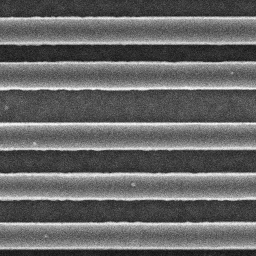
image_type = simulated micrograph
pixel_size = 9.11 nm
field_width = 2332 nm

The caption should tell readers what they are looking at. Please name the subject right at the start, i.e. lines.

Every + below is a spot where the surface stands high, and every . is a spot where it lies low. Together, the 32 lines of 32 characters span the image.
................................
................................
++++++++++++++++++++++++++++++++
++++++++++++++++++++++++++++++++
++++++++++++++++++++++++++++++++
++++++++++++++++++++++++++++++++
................................
................................
++++++++++++++++++++++++++++++++
++++++++++++++++++++++++++++++++
++++++++++++++++++++++++++++++++
................................
................................
................................
................................
++.+++++++++++++++++++++++++++++
++++++++++++++++++++++++++++++++
++++++++++++++++++++++++++++++++
++++++++++++++++++++++++++++++++
................................
................................
................................
++++++++++++++++++++++++++++++++
++++++++++++++++++++++++++++++++
++++++++++++++++++++++++++++++++
................................
................................
................................
++++++++++++++++++++++++++++++++
++++++++++++++++++++++++++++++++
++++++++++++++++++++++++++++++++
................................